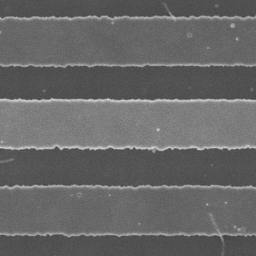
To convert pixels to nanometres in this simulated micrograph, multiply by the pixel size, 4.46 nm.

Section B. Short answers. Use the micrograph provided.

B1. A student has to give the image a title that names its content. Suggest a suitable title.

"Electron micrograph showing lines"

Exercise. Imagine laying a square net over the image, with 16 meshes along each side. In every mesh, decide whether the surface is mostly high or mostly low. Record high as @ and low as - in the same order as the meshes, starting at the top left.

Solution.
----------------
@@@@@@@@@@@@@@@@
@@@@@@@@@@@@@@@@
@@@@@@@@@@@@@@@@
----------------
----------------
@@@@@@@@@@@@@@@@
@@@@@@@@@@@@@@@@
@@@@@@@@@@@@@@@@
----------------
----------------
----------------
@@@@@@@@@@@@@@@@
@@@@@@@@@@@@@@@@
@@@@@@@@@@@@@@@@
----------------